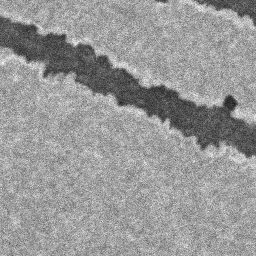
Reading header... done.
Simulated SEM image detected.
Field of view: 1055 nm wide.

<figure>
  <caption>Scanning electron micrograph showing one or a few lines or trenches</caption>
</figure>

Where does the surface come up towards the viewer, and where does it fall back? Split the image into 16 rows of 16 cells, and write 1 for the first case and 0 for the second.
1111111111111000
0011111111111111
0000111111111111
1000000111111111
1110000011111111
1111100000011111
1111111000000101
1111111111000000
1111111111110000
1111111111111110
1111111111111111
1111111111111111
1111111111111111
1111111111111111
1111111111111111
1111111111111111